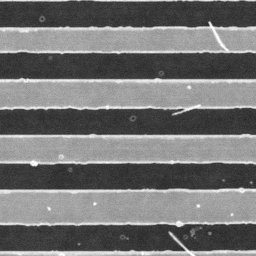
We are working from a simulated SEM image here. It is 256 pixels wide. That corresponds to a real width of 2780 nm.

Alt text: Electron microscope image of lines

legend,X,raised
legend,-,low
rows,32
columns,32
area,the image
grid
--------------------------------
--------------------------------
--------------------------------
-----------X---XX--XXXXXXXX-XX-X
XXXXXXXXXXXXXXXXXXXXXXXXXXXXXXXX
XXXXXXXXXXXXXXXXXXXXXXXXXXXXXXXX
XXXXXXXXXXXXXXXXXXXXXXXXX---XXXX
--------------------------------
--------------------------------
--------------------------------
XXXXXXXXXXXXXXXXXXXXXXXXXXXXXXXX
XXXXXXXXXXXXXXXXXXXXXXXXXXXXXXXX
XXXXXXXXXXXXXXXXXXXXXXXXXXXXXXXX
XXXXXXXXXXXXXXXXXX-XXXXXXXXXX--X
--------------------------------
--------------------------------
--------------------------------
XXXXXXXXXXXXXXXXXXXXXXXXXXXXXXXX
XXXXXXXXXXXXXXXXXXXXXXXXXXXXXXXX
XXXXXXXXXXXXXXXXXXXXXXXXXXXXXXXX
----X---------------------------
--------------------------------
--------------------------------
--------------------------------
XXXXXXXXXXXXXXXXXXXXXXXXXXXXXXXX
XXXXXXXXXXXXXXXXXXXXXXXXXXXXXXXX
XXXXXXXXXXXXXXXXXXXXXXXXXXXXXXXX
XXXXXXXXXXXXXXXXXXXXXXXXXXXXXXXX
--------------------------------
--------------------------------
--------------------------------
XXXXXXXXXXXXXXXXXXXXXXXXXXXXXXXX